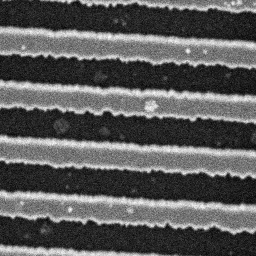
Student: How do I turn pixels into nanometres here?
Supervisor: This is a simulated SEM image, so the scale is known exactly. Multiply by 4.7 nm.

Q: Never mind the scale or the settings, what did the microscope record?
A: lines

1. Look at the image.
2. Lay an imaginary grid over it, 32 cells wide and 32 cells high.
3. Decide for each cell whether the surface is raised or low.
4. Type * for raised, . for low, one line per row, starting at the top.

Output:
...........*****.***************
.............................*..
................................
**..............................
********************............
********************************
********************************
...............*****************
...............................*
................................
*****...........................
************************........
********************************
...*****************************
..................**************
................................
................................
********........................
**************************......
********************************
.....***************************
.....................***********
................................
................................
*************...................
****************************....
********************************
.......*************************
........................**.*****
................................
................................
***********.**..................